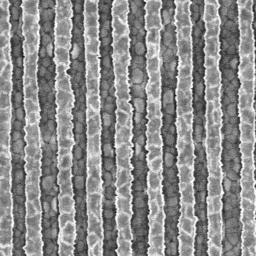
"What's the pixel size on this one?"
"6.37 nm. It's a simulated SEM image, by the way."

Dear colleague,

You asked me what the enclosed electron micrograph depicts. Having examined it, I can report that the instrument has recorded parallel lines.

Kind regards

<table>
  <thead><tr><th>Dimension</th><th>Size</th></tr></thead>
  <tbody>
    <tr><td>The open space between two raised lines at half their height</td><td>97.9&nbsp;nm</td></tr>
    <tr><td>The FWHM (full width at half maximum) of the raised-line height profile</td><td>86.7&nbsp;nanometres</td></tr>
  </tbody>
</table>